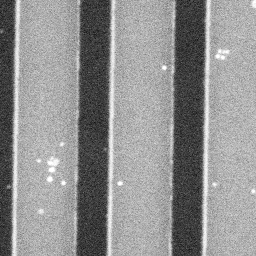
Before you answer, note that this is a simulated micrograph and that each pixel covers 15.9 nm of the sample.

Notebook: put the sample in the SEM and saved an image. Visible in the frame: lines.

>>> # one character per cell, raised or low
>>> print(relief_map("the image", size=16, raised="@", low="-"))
@----@@----@@---
@----@@----@@---
@----@@----@@---
@----@@----@@---
@----@@----@@---
@----@@----@@---
@----@@----@@---
@----@@----@@---
@----@@----@@---
@----@@----@@---
@----@@----@@---
@----@@----@@---
@----@@----@@---
@----@@----@@---
@----@@----@@---
@----@@----@@---